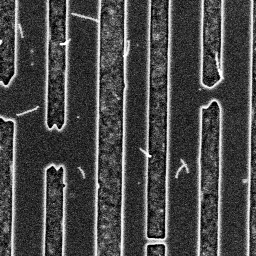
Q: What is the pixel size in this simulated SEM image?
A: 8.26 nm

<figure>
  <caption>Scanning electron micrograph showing parallel lines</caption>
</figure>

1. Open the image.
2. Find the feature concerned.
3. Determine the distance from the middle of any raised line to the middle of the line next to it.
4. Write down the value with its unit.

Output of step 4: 423 nanometers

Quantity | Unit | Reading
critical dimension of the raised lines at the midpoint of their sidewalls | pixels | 33.5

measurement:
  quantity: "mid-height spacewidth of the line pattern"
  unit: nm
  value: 154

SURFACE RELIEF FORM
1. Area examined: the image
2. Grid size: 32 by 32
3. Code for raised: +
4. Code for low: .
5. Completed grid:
..++++..++++....+++..++++...++++
..++++..++++....+++..++++...++++
..++++..++++....+++..++++...++++
..++++..++++....+++..++++...+++.
..++++..++++....+++..++++...+++.
..++++..++++....+++..++++...+++.
..++++..++++....+++..++++...+++.
..++++..++++....+++..++++...+++.
..++++..++++....+++..++++...+++.
..++++..++++....+++..++++...+++.
++++++..++++....+++..+++++.++++.
++++++..++++....+++..++++++++++.
++++++..++++....+++..++++++++++.
++++++..++++....+++..+++++.++++.
++++++..++++...++++..++++...+++.
..++++..++++...++++..++++...+++.
..++++++++++...+++...++++...+++.
..++++++++++...+++...++++...+++.
..++++++++++...+++...++++...+++.
..++++++++++...++++..++++...+++.
..++++++++++...+++...++++..++++.
..++++..++++...+++...++++..++++.
..++++..++++...+++...++++..++++.
..++++..++++...+++...++++..++++.
..++++..++++...+++...++++..++++.
..++++..++++...+++...++++..++++.
..++++..++++...+++...++++..++++.
..++++..++++...+++...++++..++++.
..++++..++++...+++...++++..++++.
..++++..++++...++++..++++..++++.
..++++..++++...++++.+++++..++++.
.+++++..++++...+++...++++..++++.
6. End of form